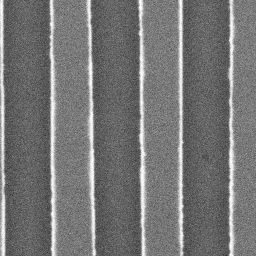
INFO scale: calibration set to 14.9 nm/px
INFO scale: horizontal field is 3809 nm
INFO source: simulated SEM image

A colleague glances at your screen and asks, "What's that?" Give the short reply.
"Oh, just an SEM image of lines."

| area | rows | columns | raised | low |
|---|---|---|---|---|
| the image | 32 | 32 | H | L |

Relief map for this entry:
LLLLLLHHHHHLLLLLLLHHHHHLLLLLLHHH
LLLLLLHHHHHLLLLLLLHHHHHLLLLLLHHH
LLLLLLHHHHHLLLLLLLHHHHHLLLLLLHHH
LLLLLLHHHHHLLLLLLLHHHHHLLLLLLHHH
LLLLLLHHHHHLLLLLLLHHHHHLLLLLLHHH
LLLLLLHHHHHLLLLLLLHHHHHLLLLLLHHH
LLLLLLHHHHHLLLLLLLHHHHHLLLLLLHHH
LLLLLLHHHHHLLLLLLLHHHHHLLLLLLHHH
LLLLLLHHHHHLLLLLLLHHHHHLLLLLLHHH
LLLLLLHHHHHLLLLLLLHHHHHLLLLLLHHH
LLLLLLHHHHHLLLLLLLHHHHHLLLLLLHHH
LLLLLLHHHHHLLLLLLLHHHHHLLLLLLHHH
LLLLLLHHHHHHLLLLLLHHHHHLLLLLLHHH
LLLLLLHHHHHLLLLLLLHHHHHLLLLLLHHH
LLLLLLHHHHHHLLLLLLHHHHHLLLLLLHHH
LLLLLLHHHHHHLLLLLLHHHHHLLLLLLHHH
LLLLLLHHHHHHLLLLLLHHHHHLLLLLLHHH
LLLLLLHHHHHHLLLLLLHHHHHLLLLLLHHH
LLLLLLHHHHHHLLLLLLHHHHHLLLLLLHHH
LLLLLLHHHHHHLLLLLLHHHHHLLLLLLHHH
LLLLLLHHHHHHLLLLLLHHHHHLLLLLLHHH
LLLLLLHHHHHHLLLLLLHHHHHLLLLLLHHH
HLLLLLHHHHHHLLLLLLHHHHHLLLLLLHHH
LLLLLLHHHHHHLLLLLLHHHHHLLLLLLHHH
HLLLLLLHHHHHLLLLLLHHHHHLLLLLLHHH
HLLLLLLHHHHHLLLLLLHHHHHLLLLLLHHH
HLLLLLLHHHHHLLLLLLHHHHHLLLLLLHHH
HLLLLLLHHHHHLLLLLLHHHHHLLLLLLHHH
HLLLLLLHHHHHLLLLLLHHHHHLLLLLLHHH
HLLLLLLHHHHHLLLLLLHHHHHLLLLLLHHH
HLLLLLLHHHHHLLLLLLHHHHHLLLLLLHHH
HLLLLLLHHHHHLLLLLLHHHHHLLLLLLHHH